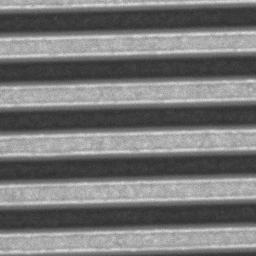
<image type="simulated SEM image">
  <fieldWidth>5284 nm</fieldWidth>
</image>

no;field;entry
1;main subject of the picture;parallel lines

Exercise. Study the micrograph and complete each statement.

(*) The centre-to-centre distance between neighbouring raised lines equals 1010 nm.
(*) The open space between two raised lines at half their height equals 26.5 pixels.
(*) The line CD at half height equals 467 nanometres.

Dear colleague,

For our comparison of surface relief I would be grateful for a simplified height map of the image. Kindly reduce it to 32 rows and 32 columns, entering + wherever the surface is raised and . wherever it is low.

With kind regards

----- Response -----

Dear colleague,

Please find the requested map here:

++++++++++++++++++++++++++++....
................................
................................
................................
......++++++++++++++++++++++++++
++++++++++++++++++++++++++++++++
++++++++++++++++++++++++++++++++
................................
................................
................................
...........+++++++++++++++++++++
++++++++++++++++++++++++++++++++
++++++++++++++++++++++++++++++++
................................
................................
................................
................++++++++++++++++
++++++++++++++++++++++++++++++++
++++++++++++++++++++++++++++++++
++++++..........................
................................
................................
......................++++++++++
++++++++++++++++++++++++++++++++
++++++++++++++++++++++++++++++++
++++++++++++....................
................................
................................
...........................+++++
++++++++++++++++++++++++++++++++
++++++++++++++++++++++++++++++++
+++++++++++++...................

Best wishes